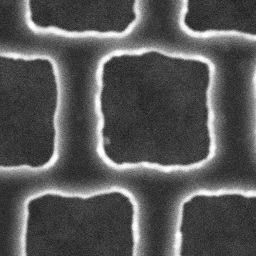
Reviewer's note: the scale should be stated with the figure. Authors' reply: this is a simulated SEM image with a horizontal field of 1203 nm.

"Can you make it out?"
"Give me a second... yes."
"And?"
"holes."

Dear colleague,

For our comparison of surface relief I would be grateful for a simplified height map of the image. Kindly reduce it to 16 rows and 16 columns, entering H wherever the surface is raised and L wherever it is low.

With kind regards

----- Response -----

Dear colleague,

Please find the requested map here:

HHLLLLLLHHHHLLLL
HHLLLLLLHHHHLLLL
HHHHHHHHHHHHHHHH
HHHHHHHLLLLHHHHH
LLLHHHLLLLLLLHHH
LLLLHHLLLLLLLHHH
LLLLHHLLLLLLLHHH
LLLHHHLLLLLLLHHH
LLLHHHLLLLLLLHHH
LLLHHHHLLLLLLHHH
HHHHHHHHHHHHHHHH
HHHHHHHHHHHHHHHH
HHLLLLLLHHHHLLLL
HHLLLLLLHHHLLLLL
HHLLLLLLHHHLLLLL
HHLLLLLLHHHLLLLL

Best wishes